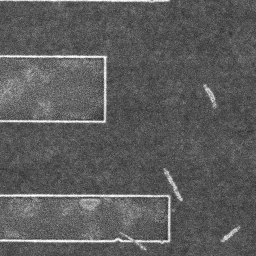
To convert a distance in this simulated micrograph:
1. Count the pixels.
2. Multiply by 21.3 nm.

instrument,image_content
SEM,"one or a few lines or trenches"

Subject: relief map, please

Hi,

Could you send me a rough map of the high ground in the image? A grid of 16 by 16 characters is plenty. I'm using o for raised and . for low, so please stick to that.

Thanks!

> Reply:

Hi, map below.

oooooooooooooooo
oooooooooooooooo
oooooooooooooooo
.ooooooooooooooo
.......ooooooooo
.......ooooooooo
.......ooooooooo
......oooooooooo
oooooooooooooooo
oooooooooooooooo
oooooooooooooooo
oooooooooooooooo
..........oooooo
...........ooooo
...........ooooo
oooooooooooooooo